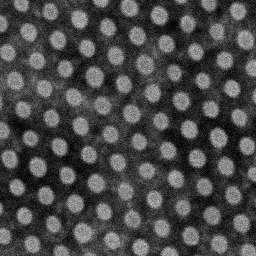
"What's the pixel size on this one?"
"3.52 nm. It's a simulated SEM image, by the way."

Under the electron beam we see a regular array of raised bodies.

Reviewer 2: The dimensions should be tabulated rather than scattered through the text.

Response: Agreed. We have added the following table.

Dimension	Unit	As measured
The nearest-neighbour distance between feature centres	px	29.2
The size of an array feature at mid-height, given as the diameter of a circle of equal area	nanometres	54.6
